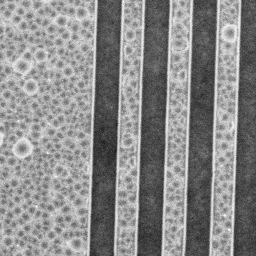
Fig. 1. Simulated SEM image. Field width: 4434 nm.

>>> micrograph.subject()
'parallel lines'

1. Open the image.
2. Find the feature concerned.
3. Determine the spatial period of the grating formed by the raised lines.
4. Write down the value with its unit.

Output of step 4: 0.831 micrometres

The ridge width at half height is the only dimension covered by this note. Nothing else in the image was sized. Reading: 20.6 px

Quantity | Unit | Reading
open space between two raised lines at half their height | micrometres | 0.465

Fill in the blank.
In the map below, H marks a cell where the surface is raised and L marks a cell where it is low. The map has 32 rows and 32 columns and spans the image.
HHHHHHHHHHHHLLLHHHLLLHHHLLLHHHLL
HHHHHHHHHHHHLLLHHHLLLHHHLLLHHHLL
HHHHHHHHHHHHLLLHHHLLLHHHLLLHHHLL
HHHHHHHHHHHHLLLHHHLLLHHHLLLHHHLL
HHHHHHHHHHHHLLLHHHLLLHHHLLLHHHLL
HHHHHHHHHHHHLLLHHHLLLHHHLLLHHHLL
HHHHHHHHHHHHLLLHHHLLLHHHLLLHHHLL
HHHHHHHHHHHHLLLHHHLLLHHHLLLHHHLL
HHHHHHHHHHHHLLLHHHLLLHHHLLLHHHLL
HHHHHHHHHHHHLLLHHHLLLHHHLLLHHHLL
HHHHHHHHHHHHLLLHHHLLLHHHLLLHHHLL
HHHHHHHHHHHHLLLHHHLLLHHHLLLHHHLL
HHHHHHHHHHHHLLLHHLLLLHHHLLLHHHLL
HHHHHHHHHHHHLLLHHLLLLHHHLLLHHHLL
HHHHHHHHHHHLLLLHHLLLLHHLLLLHHHLL
HHHHHHHHHHHLLLLHHLLLLHHLLLLHHLLL
HHHHHHHHHHHLLLLHHLLLLHHLLLLHHLLL
HHHHHHHHHHHLLLLHHLLLLHHLLLLHHLLL
HHHHHHHHHHHLLLLHHLLLLHHLLLLHHLLL
HHHHHHHHHHHLLLLHHLLLLHHLLLLHHLLL
HHHHHHHHHHHLLLLHHLLLLHHLLLLHHLLL
HHHHHHHHHHHLLLLHHLLLLHHLLLLHHLLL
HHHHHHHHHHHLLLLHHLLLLHHLLLLHHLLL
HHHHHHHHHHHLLLLHHLLLLHHLLLLHHLLL
HHHHHHHHHHHLLLLHHLLLLHHLLLLHHLLL
HHHHHHHHHHHLLLLHHLLLLHHLLLLHHLLL
HHHHHHHHHHHLLLLHHLLLLHHLLLLHHLLL
HHHHHHHHHHHLLLLHHLLLLHHLLLLHHLLL
HHHHHHHHHHHLLLLHHLLLLHHLLLHHHLLL
HHHHHHHHHHHLLLHHHLLLLHHLLLHHHLLL
HHHHHHHHHHHLLLHHHLLLHHHLLLHHHLLL
HHHHHHHHHHHLLLHHHLLLHHHLLLHHHLLL